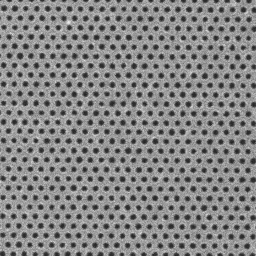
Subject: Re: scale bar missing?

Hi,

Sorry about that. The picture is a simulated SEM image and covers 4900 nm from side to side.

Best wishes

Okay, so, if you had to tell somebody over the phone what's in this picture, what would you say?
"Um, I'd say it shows a regular array of holes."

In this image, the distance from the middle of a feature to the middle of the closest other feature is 201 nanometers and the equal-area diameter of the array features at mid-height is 122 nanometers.